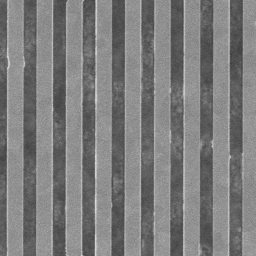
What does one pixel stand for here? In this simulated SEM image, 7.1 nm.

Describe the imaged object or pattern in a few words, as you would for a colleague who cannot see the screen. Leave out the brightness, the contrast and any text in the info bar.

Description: parallel lines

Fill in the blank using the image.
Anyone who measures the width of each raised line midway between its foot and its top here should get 111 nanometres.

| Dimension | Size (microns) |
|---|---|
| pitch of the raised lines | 0.209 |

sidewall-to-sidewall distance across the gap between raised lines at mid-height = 95 nm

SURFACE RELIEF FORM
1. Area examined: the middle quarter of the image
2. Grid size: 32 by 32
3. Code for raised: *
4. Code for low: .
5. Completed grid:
.***....****...****....***....**
.***....****...****....***....**
.***....****...****....***....**
.***..*.****...****....***....**
.***..*.****...****....***....**
.***....****...****....***....**
.***....****...****....***....**
.***....****...****....***....**
.***....****...****....***....**
.***....****...****....***....**
.***....****...****....***....**
.***....****...****....***....**
.***....****...****....***....**
.***....****...****....***....**
.***....****...****....***....**
.***....****...****....***....**
.***....****...****....***....**
.***....****...****....***....**
.***....****...****....***....**
.***....****...****....***....**
.***....****...****....***....**
.***....****...****....***....**
.***....****...****....***....**
.***....****...****....***....**
.***....****...****....***....**
.***....****...****....***....**
.***....****...****....***....**
.***....****...****....***....**
.***....*****..****....***....**
.***....******.****....***....**
.***....****.*.****....***....**
.***....****...****....***....**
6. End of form